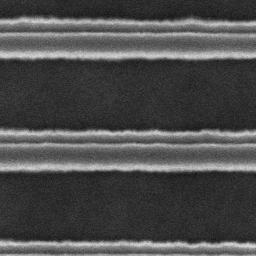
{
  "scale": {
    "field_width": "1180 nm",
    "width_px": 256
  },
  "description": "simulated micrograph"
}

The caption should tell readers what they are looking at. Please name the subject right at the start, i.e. lines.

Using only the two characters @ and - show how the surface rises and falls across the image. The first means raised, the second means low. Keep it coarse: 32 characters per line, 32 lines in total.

--------------------------------
--------------------------------
--------------------------------
@@@@@@@@@@@@@@@@@@@@@@@@@@@@@@@@
@@@@@@@@@@@@@@@@@@@@@@@@@@@@@@@@
@@@@@@@@@@@@@@@@@@@@@@@@@@@@@@@@
@@@@@@@@@@@@@@@@@@@@@@@@@@@@@@@@
--------------------------------
--------------------------------
--------------------------------
--------------------------------
--------------------------------
--------------------------------
--------------------------------
--------------------------------
--------------------------------
--------------------------------
@@@@@@@@@@@@@@@@@@@@@@@@@@@@@@@@
@@@@@@@@@@@@@@@@@@@@@@@@@@@@@@@@
@@@@@@@@@@@@@@@@@@@@@@@@@@@@@@@@
@@@@@@@@@@@@@@@@@@@@@@@@@@@@@@@@
--------------------------------
--------------------------------
--------------------------------
--------------------------------
--------------------------------
--------------------------------
--------------------------------
--------------------------------
--------------------------------
----@@@-------------------------
@@@@@@@@@@@@@@@@@@@@@@@@@@@@@@@@